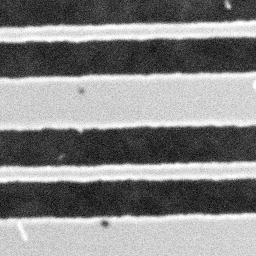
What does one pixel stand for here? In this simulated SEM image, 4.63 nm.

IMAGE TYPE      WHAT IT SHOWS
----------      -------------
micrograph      lines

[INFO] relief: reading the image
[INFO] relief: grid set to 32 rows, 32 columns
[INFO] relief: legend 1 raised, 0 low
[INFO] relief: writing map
00000000000000000000000000000000
00000000000000000000000000000000
00000000000000000000000000000000
00011111111111111111111111111111
11111111111111111111111111111111
00000000000000000000000000000000
00000000000000000000000000000000
00000000000000000000000000000000
00000000000000000000000000000000
00000000000111111111111111111111
11111111111111111111111111111111
11111111111111111111111111111111
11111111111111111111111111111111
11111111111111111111111111111111
11111111111111111111111111111111
11111111111111111111111111111111
00000000000000000000000000000000
00000000000000000000000000000000
00000000000000000000000000000000
00000000000000000000000000000000
00000000000000000000001111111111
11111111111111111111111111111111
11111111111100000000000000000000
00000000000000000000000000000000
00000000000000000000000000000000
00000000000000000000000000000000
00000000000000000000000000000000
01111111111111111111111111111111
11111111111111111111111111111111
11111111111111111111111111111111
11111111111111111111111111111111
11111111111111111111111111111111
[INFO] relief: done